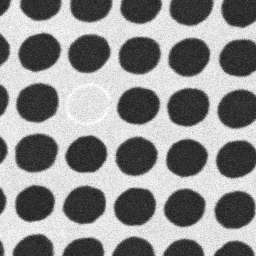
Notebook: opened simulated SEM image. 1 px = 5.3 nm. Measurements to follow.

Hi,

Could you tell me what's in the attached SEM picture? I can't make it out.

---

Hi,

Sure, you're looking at a regular array of holes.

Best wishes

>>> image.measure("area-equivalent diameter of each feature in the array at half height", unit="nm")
214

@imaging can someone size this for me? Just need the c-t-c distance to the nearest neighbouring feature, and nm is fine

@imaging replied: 264